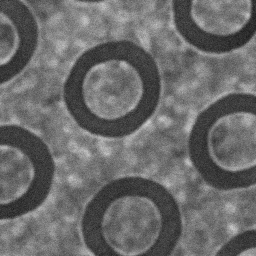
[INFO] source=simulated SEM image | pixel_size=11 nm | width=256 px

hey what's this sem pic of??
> ring-shaped grooves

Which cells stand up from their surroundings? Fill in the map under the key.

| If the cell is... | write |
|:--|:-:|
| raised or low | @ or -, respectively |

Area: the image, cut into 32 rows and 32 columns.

---@@@@@@@@@@@@@@@@@@---@@@@@@@-
----@@@@@@@@@@@@@@@@@@--@@@@@@@-
@----@@@@@@@@@@@@@@@@@--@@@@@@@-
@@---@@@@@@@@@@@@@@@@@---@@@@@--
@@---@@@@@@@@@@@@@@@@@@---------
@@---@@@@@@@-----@@@@@@@-------@
@@--@@@@@@--------@@@@@@@----@@@
@---@@@@@@---------@@@@@@@@@@@@@
---@@@@@@---@@@@----@@@@@@@@@@@@
--@@@@@@---@@@@@@---@@@@@@@@@@@@
@@@@@@@@--@@@@@@@@--@@@@@@@@@@@@
@@@@@@@@--@@@@@@@@--@@@@@@@@@@@@
@@@@@@@@---@@@@@@---@@@@@@@-----
@@@@@@@@---@@@@@@---@@@@@@------
@@@@@@@@@---@@@----@@@@@@----@@@
@@@@@@@@@@--------@@@@@@---@@@@@
----@@@@@@@------@@@@@@@--@@@@@@
-----@@@@@@@@@@@@@@@@@@---@@@@@@
@@----@@@@@@@@@@@@@@@@@@--@@@@@@
@@@----@@@@@@@@@@@@@@@@@--@@@@@@
@@@@---@@@@@@@@@@@@@@@@@---@@@@@
@@@@---@@@@@@@@@@@@@@@@@@-------
@@@@---@@@@@@@-----@@@@@@-------
@@@---@@@@@@@--------@@@@@@---@@
@@----@@@@@@----------@@@@@@@@@@
-----@@@@@@---@@@@@---@@@@@@@@@@
----@@@@@@---@@@@@@@---@@@@@@@@@
@@@@@@@@@@---@@@@@@@---@@@@@@@@@
@@@@@@@@@@---@@@@@@@---@@@@@@@@@
@@@@@@@@@@---@@@@@@@---@@@@@@---
@@@@@@@@@@@---@@@@@---@@@@@@----
@@@@@@@@@@@----@@@----@@@@@----@